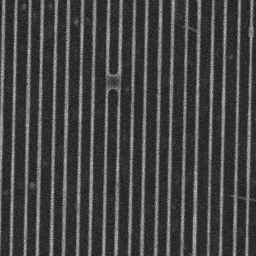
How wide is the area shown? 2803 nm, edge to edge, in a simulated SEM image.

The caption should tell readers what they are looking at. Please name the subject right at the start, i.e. parallel lines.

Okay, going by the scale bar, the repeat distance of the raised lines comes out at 143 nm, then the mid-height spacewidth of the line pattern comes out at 118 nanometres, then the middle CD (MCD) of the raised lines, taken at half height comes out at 21.9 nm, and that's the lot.